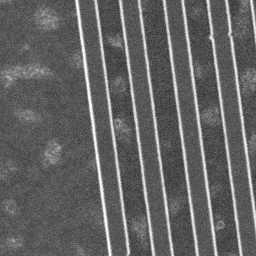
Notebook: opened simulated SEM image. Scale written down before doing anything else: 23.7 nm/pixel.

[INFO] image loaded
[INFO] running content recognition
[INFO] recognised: parallel lines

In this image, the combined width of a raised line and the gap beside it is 1020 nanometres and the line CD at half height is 19.2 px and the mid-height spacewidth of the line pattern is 578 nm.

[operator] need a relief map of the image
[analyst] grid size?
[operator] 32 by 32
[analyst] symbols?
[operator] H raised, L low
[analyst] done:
LLLLLLLLLLHHLLLHHLLLLHHLLLHHLLLH
LLLLLLLLLLHHLLLHHHLLLHHLLLHHHLLL
LLLLLLLLLLHHLLLHHHLLLHHLLLHHHLLL
LLLLLLLLLLHHLLLHHHLLLHHLLLHHHLLL
LLLLLLLLLLHHHLLLHHLLLHHLLLHHHLLL
LLLLLLLLLLHHHLLLHHLLLHHHLLLHHLLL
LLLLLLLLLLHHHLLLHHLLLHHHLLLHHLLL
LLLLLLLLLLLHHLLLHHLLLHHHLLLHHLLL
LLLLLLLLLLLHHLLLHHHLLLHHLLLHHLLL
LLLLLLLLLLLHHLLLHHHLLLHHLLLHHHLL
LLLLLLLLLLLHHLLLHHHLLLHHLLLHHHLL
LLLLLLLLLLLHHLLLLHHLLLHHLLLHHHLL
LLLLLLLLLLLHHHLLLHHLLLHHLLLLHHLL
LLLLLLLLLLLHHHLLLHHLLLHHHLLLHHLL
LLLLLLLLLLLLHHLLLHHLLLHHHLLLHHLL
LLLLLLLLLLLLHHLLLHHLLLLHHLLLHHLL
LLLLLLLLLLLLHHLLLHHHLLLHHLLLHHLL
LLLLLLLLLLLLHHLLLHHHLLLHHLLLHHHL
LLLLLLLLLLLLHHLLLHHHLLLHHLLLHHHL
LLLLLLLLLLLLHHHLLLHHLLLHHLLLHHHL
LLLLLLLLLLLLHHHLLLHHLLLHHHLLLHHL
LLLLLLLLLLLLHHHLLLHHLLLHHHLLLHHL
LLLLLLLLLLLLLHHLLLHHLLLHHHLLLHHL
LLLLLLLLLLLLLHHLLLHHLLLLHHLLLHHL
LLLLLLLLLLLLLHHLLLHHHLLLHHLLLHHH
LLLLLLLLLLLLLHHLLLHHHLLLHHLLLHHH
LLLLLLLLLLLLLHHLLLHHHLLLHHLLLHHH
LLLLLLLLLLLLLHHHLLLHHLLLHHLLLLHH
LLLLLLLLLLLLLHHHLLLHHLLLHHHLLLHH
LLLLLLLLLLLLLHHHLLLHHLLLHHHLLLHH
LLLLLLLLLLLLLLHHLLLHHLLLLHHLLLHH
LLLLLLLLLLLLLLHHLLLHHHLLLHHLLLHH